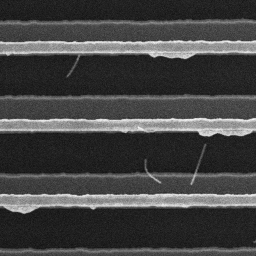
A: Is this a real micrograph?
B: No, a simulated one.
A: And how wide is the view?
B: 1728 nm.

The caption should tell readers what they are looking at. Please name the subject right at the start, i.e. lines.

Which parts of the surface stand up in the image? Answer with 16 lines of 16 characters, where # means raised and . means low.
................
################
################
..........##....
................
................
################
################
................
................
................
################
################
................
................
................